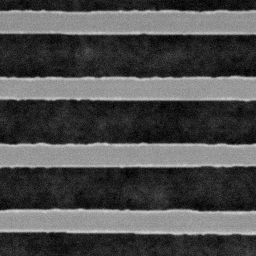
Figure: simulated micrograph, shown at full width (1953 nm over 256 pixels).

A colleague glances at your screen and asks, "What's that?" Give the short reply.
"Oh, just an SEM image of lines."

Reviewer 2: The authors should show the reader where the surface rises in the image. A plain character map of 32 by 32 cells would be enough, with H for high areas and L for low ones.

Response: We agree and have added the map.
LLLLLLLLLLLLLLLLLLLLLLLLLLLLLLLL
HHHHHHHHLLLHHHHHHHHHHHHHHHHHHHHH
HHHHHHHHHHHHHHHHHHHHHHHHHHHHHHHH
HHHHHHHHHHHHHHHHHHHHHHHHHHHHHHHH
LLLLLLLLLLLLLLLLLLLLLLLLLLLLLLLL
LLLLLLLLLLLLLLLLLLLLLLLLLLLLLLLL
LLLLLLLLLLLLLLLLLLLLLLLLLLLLLLLL
LLLLLLLLLLLLLLLLLLLLLLLLLLLLLLLL
LLLLLLLLLLLLLLLLLLLLLLLLLLLLLLLL
LLLLLLLLLLLLLLLLLLLLLLLLLLLLLLLL
HHHHHHHHHHHHHHHHHHHHHHHHHHHHHHHH
HHHHHHHHHHHHHHHHHHHHHHHHHHHHHHHH
LLLLLLLLLLLLLLLLLLLLLLLLLLLLLLHH
LLLLLLLLLLLLLLLLLLLLLLLLLLLLLLLL
LLLLLLLLLLLLLLLLLLLLLLLLLLLLLLLL
LLLLLLLLLLLLLLLLLLLLLLLLLLLLLLLL
LLLLLLLLLLLLLLLLLLLLLLLLLLLLLLLL
LLLLLLLLLLLLLLLLLLLLLLLLLLLLLLLL
HHHHHHHHHHHHHHHHHHHHHHHHHHHHHHHH
HHHHHHHHHHHHHHHHHHHHHHHHHHHHHHHH
HHHHHHHHHHHHHHHHHHHHHHHHHHHHHHHH
LLLLLLLLLLLLLLLLLLLLLLLLLLLLLLLL
LLLLLLLLLLLLLLLLLLLLLLLLLLLLLLLL
LLLLLLLLLLLLLLLLLLLLLLLLLLLLLLLL
LLLLLLLLLLLLLLLLLLLLLLLLLLLLLLLL
LLLLLLLLLLLLLLLLLLLLLLLLLLLLLLLL
HHHHHHHHHHHHHHHHHHHHHHHHHLLLLLLL
HHHHHHHHHHHHHHHHHHHHHHHHHHHHHHHH
HHHHHHHHHHHHHHHHHHHHHHHHHHHHHHHH
LLLLLLLLLLLLLLLLLLLLLLLLLLLLLLLL
LLLLLLLLLLLLLLLLLLLLLLLLLLLLLLLL
LLLLLLLLLLLLLLLLLLLLLLLLLLLLLLLL